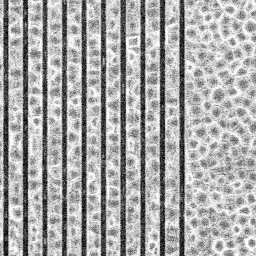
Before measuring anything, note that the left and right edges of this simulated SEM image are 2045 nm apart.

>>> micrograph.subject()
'parallel lines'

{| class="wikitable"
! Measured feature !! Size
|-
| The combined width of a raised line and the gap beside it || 156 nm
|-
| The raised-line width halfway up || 114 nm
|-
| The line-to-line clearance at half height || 43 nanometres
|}